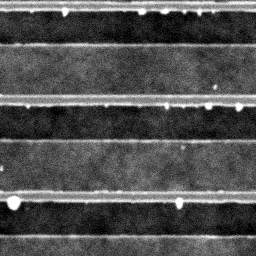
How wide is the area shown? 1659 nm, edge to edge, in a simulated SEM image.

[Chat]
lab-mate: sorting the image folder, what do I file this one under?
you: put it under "lines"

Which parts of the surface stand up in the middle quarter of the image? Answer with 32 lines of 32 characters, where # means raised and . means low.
################################
################################
################################
################################
################################
################################
################################
################################
################################
################################
.........................#...#..
................................
................................
................................
................................
................................
................................
................................
................................
################################
################################
################################
################################
################################
################################
################################
################################
################################
################################
################################
################################
################################